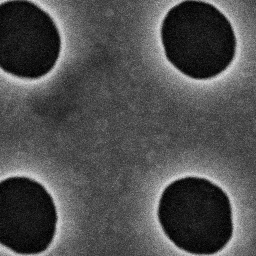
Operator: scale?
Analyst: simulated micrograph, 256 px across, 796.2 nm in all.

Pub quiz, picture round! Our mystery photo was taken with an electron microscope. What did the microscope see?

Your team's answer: holes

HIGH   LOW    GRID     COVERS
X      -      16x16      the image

---XXXXXXXX--XXX
---XXXXXXX----XX
----XXXXXX-----X
----XXXXXX-----X
---XXXXXXXX---XX
XXXXXXXXXXXXXXXX
XXXXXXXXXXXXXXXX
XXXXXXXXXXXXXXXX
XXXXXXXXXXXXXXXX
XXXXXXXXXXXXXXXX
XXXXXXXXXXXXXXXX
---XXXXXXXX--XXX
---XXXXXXX----XX
----XXXXXX-----X
---XXXXXXX-----X
---XXXXXXXX---XX